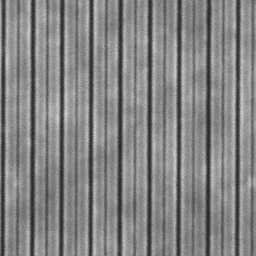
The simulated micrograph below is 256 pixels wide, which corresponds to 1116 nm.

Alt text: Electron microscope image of parallel lines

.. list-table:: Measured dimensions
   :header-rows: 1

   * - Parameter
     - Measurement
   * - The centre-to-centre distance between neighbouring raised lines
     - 63.8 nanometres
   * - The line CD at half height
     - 46.3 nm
